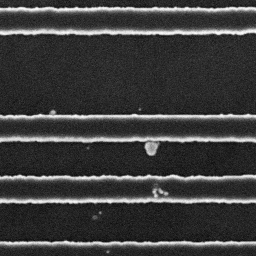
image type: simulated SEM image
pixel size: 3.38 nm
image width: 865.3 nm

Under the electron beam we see lines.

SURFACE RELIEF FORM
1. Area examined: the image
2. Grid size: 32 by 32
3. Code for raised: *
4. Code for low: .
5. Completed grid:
................................
********************************
********************************
********************************
................................
................................
................................
................................
................................
................................
................................
................................
................................
................................
********************************
********************************
********************************
********************************
................................
................................
................................
................................
********************************
********************************
********************************
................................
................................
................................
................................
................................
********************************
********************************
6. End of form